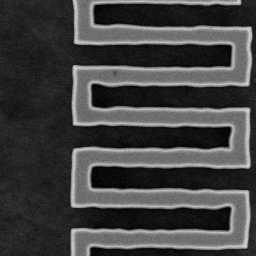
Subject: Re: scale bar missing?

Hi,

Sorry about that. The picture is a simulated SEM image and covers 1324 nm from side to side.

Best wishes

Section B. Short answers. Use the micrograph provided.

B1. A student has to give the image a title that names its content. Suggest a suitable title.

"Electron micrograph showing groups of lines, slits or small figures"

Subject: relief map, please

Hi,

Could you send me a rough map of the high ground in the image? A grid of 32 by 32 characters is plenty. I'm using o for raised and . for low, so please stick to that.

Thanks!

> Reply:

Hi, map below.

.........ooo.............o..o...
.........ooo....................
.........ooo....................
.........oooooooooooooooooooooo.
.........oooooooooooooooooooooo.
...........oo............oo.ooo.
.............................oo.
.............................oo.
.........ooooooooo...oo.ooooooo.
.........oooooooooooooooooooooo.
.........ooo.oooooooooooooooooo.
.........oo.....................
.........oo.....................
.........ooo..ooo...............
.........oooooooooooooooooooooo.
..........ooooooooooooooooooooo.
.............................oo.
.............................oo.
..........ooo...............ooo.
.........oooooooooooooooooooooo.
.........oooooooooooooooooooooo.
.........oo.....................
.........oo.....................
.........ooo....................
.........oooooooooooooooooooooo.
.........oooooooooooooooooooooo.
.............................oo.
.............................oo.
.............................oo.
.........oooooooooooooooooooooo.
.........oooooooooooooooooooooo.
.........oo.....................